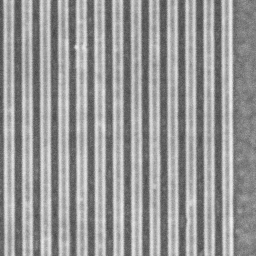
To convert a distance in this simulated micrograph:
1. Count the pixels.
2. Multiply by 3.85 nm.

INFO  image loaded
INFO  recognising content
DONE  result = parallel lines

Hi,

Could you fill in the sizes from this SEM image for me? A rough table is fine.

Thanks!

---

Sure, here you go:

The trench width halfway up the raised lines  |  39.5 nanometers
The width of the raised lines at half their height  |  0.0327 microns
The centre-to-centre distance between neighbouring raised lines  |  70 nm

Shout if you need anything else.